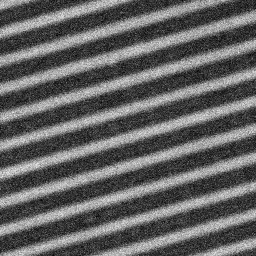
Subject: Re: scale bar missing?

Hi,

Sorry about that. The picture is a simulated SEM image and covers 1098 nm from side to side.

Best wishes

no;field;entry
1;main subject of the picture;parallel lines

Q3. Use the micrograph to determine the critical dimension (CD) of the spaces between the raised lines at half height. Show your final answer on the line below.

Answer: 83.4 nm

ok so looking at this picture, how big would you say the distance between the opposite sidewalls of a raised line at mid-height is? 0.0335 µm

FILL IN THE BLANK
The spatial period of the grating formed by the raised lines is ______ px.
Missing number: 27.2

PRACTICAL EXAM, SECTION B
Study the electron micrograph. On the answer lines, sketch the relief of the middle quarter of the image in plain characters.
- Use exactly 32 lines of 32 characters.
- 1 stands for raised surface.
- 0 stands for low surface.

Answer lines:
01111111000000000000000000111111
11111000000000000000001111111000
10000000000000000001111111000000
00000000000000011111110000000000
00000000000011111110000000000000
00000000111111100000000000000000
00000111111100000000000000000111
01111111000000000000000000111111
11111000000000000000000111111000
10000000000000000011111111000000
00000000000000001111111000000000
00000000000011111110000000000000
00000000011111110000000000000000
00000111111100000000000000000011
00111111100000000000000000111111
11111000000000000000000111111100
11000000000000000001111111000000
00000000000000001111111000000000
00000000000011111110000000000000
00000000011111110000000000000000
00000011111100000000000000000011
00111111100000000000000000011111
11111000000000000000000111111100
11000000000000000000111111100000
00000000000000001111111000000000
00000000000001111111000000000000
00000000011111110000000000000000
00000011111110000000000000000011
00111111100000000000000000011111
11111100000000000000000111111100
11000000000000000000111111100000
00000000000000000111111000000000